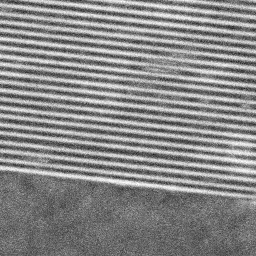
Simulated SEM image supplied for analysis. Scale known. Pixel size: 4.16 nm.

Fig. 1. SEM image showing parallel lines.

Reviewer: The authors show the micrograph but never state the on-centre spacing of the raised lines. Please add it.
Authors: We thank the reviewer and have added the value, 35.5 nanometres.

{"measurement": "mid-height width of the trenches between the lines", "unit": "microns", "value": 0.0263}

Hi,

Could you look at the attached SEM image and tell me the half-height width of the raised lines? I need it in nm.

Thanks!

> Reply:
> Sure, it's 11.4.